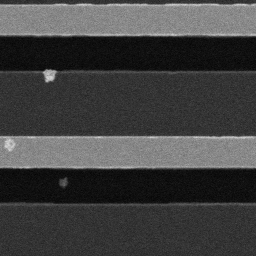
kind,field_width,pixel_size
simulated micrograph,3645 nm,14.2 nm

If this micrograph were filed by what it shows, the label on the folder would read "lines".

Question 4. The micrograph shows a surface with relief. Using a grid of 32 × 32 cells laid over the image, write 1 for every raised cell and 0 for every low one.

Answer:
11111111111111111111111111111111
11111111111111111111111111111111
11111111111111111111111111111111
11111111111111111111111111111111
00000000000000000000000000000000
00000000000000000000000000000000
00000000000000000000000000000000
00000000000000000000000000000000
00000000000000000000000000000000
11111111111111111111111111111111
11111111111111111111111111111111
11111111111111111111111111111111
11111111111111111111111111111111
11111111111111111111111111111111
11111111111111111111111111111111
11111111111111111111111111111111
11111111111111111111111111111111
11111111111111111111111111111111
11111111111111111111111111111111
11111111111111111111111111111111
11111111111111111111111111111111
00000000000000000000000000000000
00000000000000000000000000000000
00000000000000000000000000000000
00000000000000000000000000000000
00000000000000000000000000000000
11111111111111111111111111111111
11111111111111111111111111111111
11111111111111111111111111111111
11111111111111111111111111111111
11111111111111111111111111111111
11111111111111111111111111111111